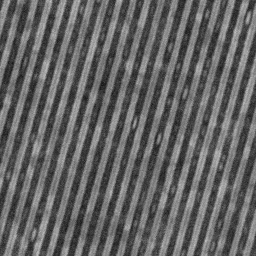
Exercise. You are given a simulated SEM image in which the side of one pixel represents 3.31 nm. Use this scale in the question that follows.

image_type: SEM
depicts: parallel lines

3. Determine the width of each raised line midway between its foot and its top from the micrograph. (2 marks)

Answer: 18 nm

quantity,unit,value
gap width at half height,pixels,8.1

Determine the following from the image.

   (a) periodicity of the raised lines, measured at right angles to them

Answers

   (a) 44.9 nanometers